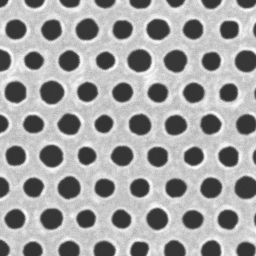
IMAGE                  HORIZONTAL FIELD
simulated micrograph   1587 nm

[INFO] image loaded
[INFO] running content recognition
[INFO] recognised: a regular array of holes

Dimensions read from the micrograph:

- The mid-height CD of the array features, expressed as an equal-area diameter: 132 nm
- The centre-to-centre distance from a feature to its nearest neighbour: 218 nm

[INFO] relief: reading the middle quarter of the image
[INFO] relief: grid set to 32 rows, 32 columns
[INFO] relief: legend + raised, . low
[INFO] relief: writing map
....++++....++++......+++.....++
...+++++++.++++++....+++++....++
++++++++++++++++++++++++++++++++
++++++++++++++++++++++++++++++++
++++++++++++++++++++++++++++++++
++++....+++++....++++....+++++..
+++.....++++.....++++.....++++..
+++......+++.....++++.....++++..
++++....++++.....++++.....++++..
+++++..++++++...++++++...++++++.
++++++++++++++++++++++++++++++++
++++++++++++++++++++++++++++++++
+.++++++++++++++++..++++++++++++
....++++....++++.....+++++....++
....++++....++++......+++......+
....++++....++++......+++......+
....++++....++++......+++......+
...+++++++++++++++...+++++...+++
++++++++++++++++++++++++++++++++
++++++++++++++++++++++++++++++++
+++++.+++++++...+++++++.++++++++
++++....++++.....++++.....+++++.
+++.....++++.....++++.....++++..
+++.....++++.....++++.....++++..
++++...+++++.....++++.....++++..
++++++++++++++..++++++...+++++++
++++++++++++++++++++++++++++++++
++++++++++++++++++++++++++++++++
...++++++..+++++++..++++++++++++
....++++....+++++....+++++....++
....+++......+++.....++++......+
....+++......++++....++++......+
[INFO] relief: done